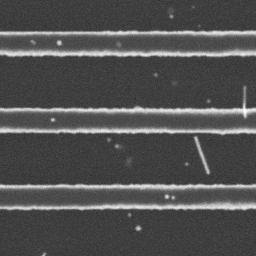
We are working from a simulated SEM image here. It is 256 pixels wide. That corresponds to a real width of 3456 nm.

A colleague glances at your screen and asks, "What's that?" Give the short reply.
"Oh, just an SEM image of lines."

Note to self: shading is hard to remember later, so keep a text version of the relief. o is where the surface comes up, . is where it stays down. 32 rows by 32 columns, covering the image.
................................
................................
................................
................................
oooooooooooooooooooooooooooooooo
oooooooooooooooooooooooooooooooo
oooooooooooooooooooooooooooooooo
................................
................................
................................
................................
................................
................................
................................
oooooooooooooooooooooooooooooooo
oooooooooooooooooooooooooooooooo
oooooooooooooooooooooooooooooooo
................................
................................
................................
................................
................................
................................
oooooooooooooooooooooooooooooooo
oooooooooooooooooooooooooooooooo
oooooooooooooooooooooooooooooooo
................................
................................
................................
................................
................................
................................